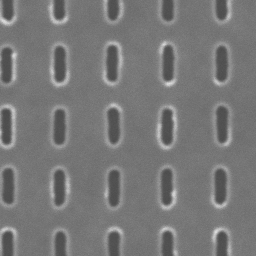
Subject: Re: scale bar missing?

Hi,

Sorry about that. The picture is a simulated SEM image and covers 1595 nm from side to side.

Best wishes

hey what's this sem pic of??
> a regular array of holes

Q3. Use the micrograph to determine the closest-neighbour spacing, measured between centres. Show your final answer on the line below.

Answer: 53.7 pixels